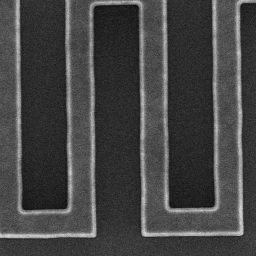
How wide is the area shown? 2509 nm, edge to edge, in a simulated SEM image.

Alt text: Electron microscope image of groups of lines, slits or small figures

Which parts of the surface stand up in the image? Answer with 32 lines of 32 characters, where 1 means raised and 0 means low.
11000000111100000111100000011100
11000000111000000011100000011100
11000000111000000011100000011100
11000000111000000011100000011100
11000000111000000011100000011100
11000000111000000011100000011100
11000000111000000011100000011100
11000000111000000011100000011100
11000000111100000011100000011100
11000000111100000011100000011100
11000000111100000011100000011100
11000000011100000011100000011100
11000000011100000011100000011100
11000000011100000011100000011100
11000000011100000011100000011100
11000000011100000011100000011100
11000000011100000011100000011100
11000000011100000011100000011100
11000000011100000011100000011100
11000000011100000011100000011100
11000000011100000011100000011100
11000000011100000011100000011100
11100000011100000011100000011100
11100000011100000011100000011100
11100000011100000011100000011100
11000000011100000011100000011100
11101111111100000011111111111100
11111111111100000011111111111100
11111111111100000011111111111100
00001110000000000000000000000000
00000000000000000000000000000000
00000000000000000000000000000000